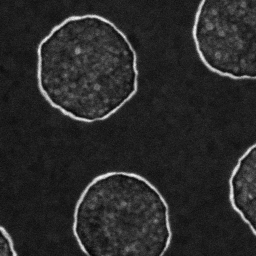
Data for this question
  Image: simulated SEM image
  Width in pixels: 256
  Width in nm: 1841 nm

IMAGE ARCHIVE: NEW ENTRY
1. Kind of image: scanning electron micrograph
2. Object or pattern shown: holes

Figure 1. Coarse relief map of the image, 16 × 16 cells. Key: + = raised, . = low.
+++++++++++++...
++++...+++++....
+++.....++++....
+++.....+++++...
++......++++++..
+++.....++++++++
+++.....++++++++
++++++++++++++++
++++++++++++++++
++++++++++++++++
+++++++++++++++.
++++++...++++++.
+++++.....+++++.
+++++.....+++++.
+++++......+++++
.++++.....++++++